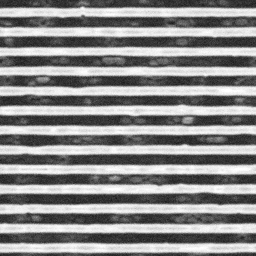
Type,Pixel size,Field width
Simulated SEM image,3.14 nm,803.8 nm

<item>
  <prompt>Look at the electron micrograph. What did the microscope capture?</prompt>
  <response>parallel lines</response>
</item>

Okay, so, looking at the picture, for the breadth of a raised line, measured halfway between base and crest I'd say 23.5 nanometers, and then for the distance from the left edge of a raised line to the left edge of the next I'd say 61.6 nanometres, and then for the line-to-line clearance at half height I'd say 0.0388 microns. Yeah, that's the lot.